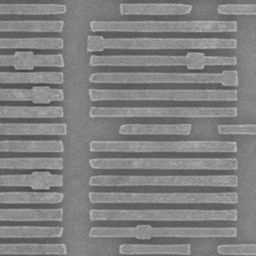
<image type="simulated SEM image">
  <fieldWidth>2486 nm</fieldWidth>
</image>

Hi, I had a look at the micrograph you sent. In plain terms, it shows wiring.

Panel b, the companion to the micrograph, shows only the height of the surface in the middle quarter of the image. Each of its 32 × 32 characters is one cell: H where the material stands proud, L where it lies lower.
LLLLLLLLLLLLLLLLLLLLLLLLLLLLLLLH
LLLLLLLLLLLLLLLLLLLLLLLLLLLLLLLL
LLLLLLLHHHHHHHHHHHHHHHHHHHHHHHHH
LLLLLLLHHHHHHHHHHHHHHHHHHHHHHHHH
LLLLLLLLHHHHHHHHHHHHHHHHHHHHHHHH
LLLLLLLLLLLLLLLLLLLLLLLLLLLLLLLL
LLLLLLLLLLLLLLLLLLLLLLLLLLLLLLLL
LLLLLLLHHHHHHHHHHHHHHHHHHHHHHHHH
LLLLLLLHHHHHHHHHHHHHHHHHHHHHHHHH
LLLLLLLLLLLLLLLLLLLLLLLLLLLLLLLL
LLLLLLLLLLLLLLLLLLLLLLLLLLLLLLLL
LLLLLLLHHHHHHHHHHHHHHHHHHHHHHHHH
LLLLLLLHHHHHHHHHHHHHHHHHHHHHHHHH
LLLLLLLLLLLLLLLLLLLLLLLLLLLLLLLL
LLLLLLLLLLLLLLLLLLLLLLLLLLLLLLLL
LLLLLLLLLLLLLLLHHHHHHHHHHHHHHHHH
LLLLLLLLLLLLLLHHHHHHHHHHHHHHHHHL
LLLLLLLLLLLLLLLLLLLLLLLLLLLLLLLL
LLLLLLLLLLLLLLLLLLLLLLLLLLLLLLLL
LLLLLLLLLLLLLLLLLLLLLLLLLLLLLLLL
LLLLLLLHHHHHHHHHHHHHHHHHHHHHHHHH
LLLLLLLHHHHHHHHHHHHHHHHHHHHHHHHH
LLLLLLLLLLLLLLLLLLLLLLLLLLLLLLLL
LLLLLLLLLLLLLLLLLLLLLLLLLLLLLLLL
LLLLLLLHHHHHHHHHHHHHHHHHHHHHHHHH
LLLLLLLHHHHHHHHHHHHHHHHHHHHHHHHH
LLLLLLLLLLLLLLLLLLLLLLLLLLLLLLLL
LLLLLLLLLLLLLLLLLLLLLLLLLLLLLLLL
LLLLLLLHHHHHHHHHHHHHHHHHHHHHHHHH
LLLLLLLHHHHHHHHHHHHHHHHHHHHHHHHH
LLLLLLLLLLLLLLLLLLLLLLLLLLLLLLLL
LLLLLLLLLLLLLLLLLLLLLLLLLLLLLLLL